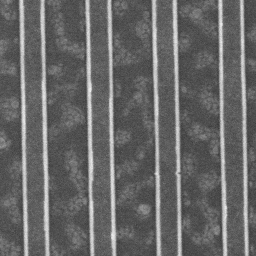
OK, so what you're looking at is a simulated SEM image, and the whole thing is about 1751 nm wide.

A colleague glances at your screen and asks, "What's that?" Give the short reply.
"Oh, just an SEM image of one or a few lines or trenches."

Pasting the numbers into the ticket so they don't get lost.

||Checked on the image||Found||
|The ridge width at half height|0.151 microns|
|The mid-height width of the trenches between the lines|302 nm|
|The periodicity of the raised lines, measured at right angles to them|454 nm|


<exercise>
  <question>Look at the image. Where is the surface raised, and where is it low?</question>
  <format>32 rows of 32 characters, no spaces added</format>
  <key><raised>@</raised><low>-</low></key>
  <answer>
---@@------@@@-----@@@-----@@@--
---@@------@@@-----@@@------@@--
---@@------@@@-----@@@------@@--
---@@------@@@-----@@@------@@--
---@@------@@@-----@@@------@@--
---@@------@@@-----@@@------@@--
---@@------@@@-----@@@------@@--
---@@------@@@-----@@@------@@--
---@@------@@@-----@@@------@@--
---@@@-----@@@-----@@@------@@--
---@@@-----@@@------@@------@@--
---@@@-----@@@------@@------@@--
---@@@-----@@@------@@------@@--
---@@@-----@@@------@@------@@--
---@@@-----@@@------@@------@@@-
---@@@-----@@@------@@------@@@-
---@@@-----@@@------@@------@@@-
---@@@-----@@@------@@------@@@-
---@@@-----@@@------@@------@@@-
---@@@-----@@@------@@------@@@-
---@@@-----@@@------@@------@@@-
---@@@-----@@@------@@------@@@-
---@@@-----@@@------@@------@@@-
---@@@-----@@@------@@------@@@-
---@@@-----@@@------@@------@@@-
---@@@-----@@@------@@------@@@-
---@@@-----@@@------@@------@@@-
---@@@-----@@@------@@------@@@-
---@@@-----@@@------@@------@@@-
---@@@------@@------@@------@@@-
---@@@------@@------@@------@@@-
---@@@------@@------@@------@@@-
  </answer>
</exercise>